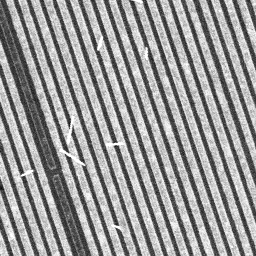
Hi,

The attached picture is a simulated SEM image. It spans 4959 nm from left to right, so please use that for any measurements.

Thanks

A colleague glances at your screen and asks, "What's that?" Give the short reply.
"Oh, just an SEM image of parallel lines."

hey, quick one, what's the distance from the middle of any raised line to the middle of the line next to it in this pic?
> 236 nm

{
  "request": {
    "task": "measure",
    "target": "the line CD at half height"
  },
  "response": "0.124 micrometres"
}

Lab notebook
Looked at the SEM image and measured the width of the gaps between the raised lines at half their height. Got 108 nanometers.